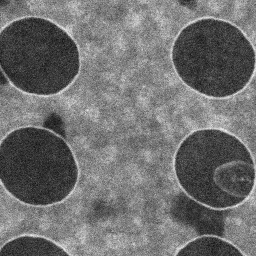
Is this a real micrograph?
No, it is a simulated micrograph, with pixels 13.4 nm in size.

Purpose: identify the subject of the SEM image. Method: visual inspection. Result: holes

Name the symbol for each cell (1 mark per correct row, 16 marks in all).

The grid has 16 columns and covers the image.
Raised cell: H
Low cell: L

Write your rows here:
HHHHHHHHHHHHHHHH
HLLHHHHHHHHHLLHH
LLLLLHHHHHHLLLLL
LLLLLHHHHHHLLLLL
LLLLLHHHHHHLLLLL
HLLLHHHHHHHHLLLH
HHHHHHHHHHHHHHHH
HHHHHHHHHHHHHHHH
LLLLHHHHHHHHLLLH
LLLLHHHHHHHLLLLL
LLLLLHHHHHHLLLLL
LLLLLHHHHHHLLLLL
HLLLHHHHHHHHLLLH
HHHHHHHHHHHHHHHH
HHHHHHHHHHHHHHHH
LLLLHHHHHHHLLLLH